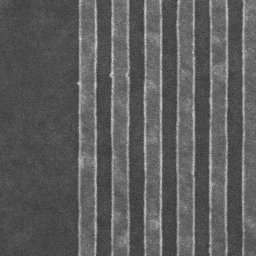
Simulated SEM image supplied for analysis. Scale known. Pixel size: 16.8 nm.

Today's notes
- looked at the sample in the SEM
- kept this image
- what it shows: parallel lines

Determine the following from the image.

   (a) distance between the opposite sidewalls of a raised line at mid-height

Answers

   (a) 269 nm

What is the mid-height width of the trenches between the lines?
283 nm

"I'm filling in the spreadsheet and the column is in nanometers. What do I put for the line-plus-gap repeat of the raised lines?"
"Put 549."